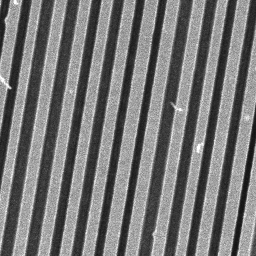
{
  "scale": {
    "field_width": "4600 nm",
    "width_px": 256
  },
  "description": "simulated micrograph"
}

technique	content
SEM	parallel lines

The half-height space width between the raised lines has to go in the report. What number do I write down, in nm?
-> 173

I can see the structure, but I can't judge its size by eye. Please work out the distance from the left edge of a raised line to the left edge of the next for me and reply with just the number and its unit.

405 nanometres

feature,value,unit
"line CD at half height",12.6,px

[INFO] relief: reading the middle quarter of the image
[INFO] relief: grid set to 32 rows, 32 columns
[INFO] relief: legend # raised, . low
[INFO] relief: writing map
.###...###..###...###..###....##
.###..###...###..####..###...###
.###...##...###..####..###...###
.###..###...###..####.####...###
.###..###...###..###..####...###
###...###..###...###..###....###
###...###..###...###..###....###
###..###...###..####..###...####
###...##...###..####..###...###.
###..###...###..####.####...###.
###..###...###..###..####..####.
##...###..###...###..###....###.
##...###..###...###..###....###.
##...###..###..####..###...####.
##...##...###..####..###...####.
##..###...###..####.####...###..
##..###...###..###..####...###..
#...###..###...###..###....###..
#...###..###...###..###....###..
#..####..###..####..###....###..
#..###...###..####..###...####..
#..###...###..####.####...###...
#..###...###..###..####...###...
...###..###...###..###....###...
...###..####..###..###....###...
..####..###..####..###...####..#
..###...###..####..###...####..#
..###...###..####.####...###...#
..###...###..###..####...###...#
..###..####..###..###....###...#
..###..###...###..###....###...#
..###..###..####..###...####...#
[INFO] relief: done